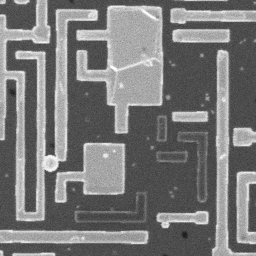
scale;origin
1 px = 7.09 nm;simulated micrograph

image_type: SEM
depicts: wiring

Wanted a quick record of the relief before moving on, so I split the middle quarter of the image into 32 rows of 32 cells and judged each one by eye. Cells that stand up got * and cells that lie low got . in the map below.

*..***.....**************.......
*..***....***************.......
*..**********************.......
*..**********************.......
*.........***************.......
*..........*************........
*..........*************........
*..........*************........
*..........*************........
*..........*************........
*...........****................
*............***................
*............***...........*****
*............***........**.*****
*............***........**......
*............***........**......
*............***........**......
*.......................**...***
*......................***...***
*...............................
*....**********.................
*....**********.................
.....**********........********.
.....**********........********.
.....**********.................
.....**********.................
.....**********.................
***************.................
***************.................
*....**********.................
.....**********.................
.....**********.................